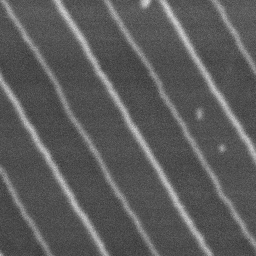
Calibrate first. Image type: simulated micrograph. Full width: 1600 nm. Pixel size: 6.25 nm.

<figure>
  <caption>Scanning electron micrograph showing lines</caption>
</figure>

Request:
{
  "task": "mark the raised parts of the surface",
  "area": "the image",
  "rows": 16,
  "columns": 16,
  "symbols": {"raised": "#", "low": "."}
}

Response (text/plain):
####...###....##
.####..####...##
..###...####...#
..####...###...#
...###...####...
....###...###...
#...####...###..
##...###...####.
##...####...###.
###...###...####
###...####...###
####...####..###
.####...###...##
..###...####...#
..####...###...#
...###...####...